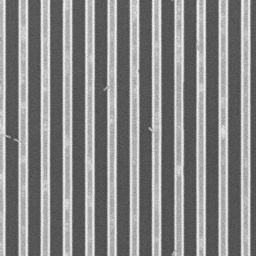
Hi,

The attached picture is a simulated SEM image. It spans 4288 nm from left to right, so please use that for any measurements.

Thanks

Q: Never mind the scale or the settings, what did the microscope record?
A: parallel lines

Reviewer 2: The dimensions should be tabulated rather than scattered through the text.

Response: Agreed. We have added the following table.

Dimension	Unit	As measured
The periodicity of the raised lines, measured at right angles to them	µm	0.373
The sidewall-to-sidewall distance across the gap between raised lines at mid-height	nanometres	253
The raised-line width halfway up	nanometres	128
